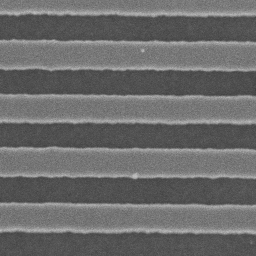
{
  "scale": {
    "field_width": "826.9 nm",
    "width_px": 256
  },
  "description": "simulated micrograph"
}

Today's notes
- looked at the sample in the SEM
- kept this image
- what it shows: lines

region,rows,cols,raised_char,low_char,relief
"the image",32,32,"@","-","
@@@@@@@@@@@@@@@@@@@@@@@@@@@@@@@@
@@@@@@@@@@@@@@@@@@@@@@@@@@@@@@@@
--------------------------------
--------------------------------
--------------------------------
@@@@@@@@@@@@@@@@@@@@@@@@@@@@@@@@
@@@@@@@@@@@@@@@@@@@@@@@@@@@@@@@@
@@@@@@@@@@@@@@@@@@@@@@@@@@@@@@@@
@@@@@@@@@@@@@@@@@@@@@@@@@@@@@@@@
--------------------------------
--------------------------------
--------------------------------
@@@@@@@@@@@@@@@@@@@@@@@@@@@@@@@@
@@@@@@@@@@@@@@@@@@@@@@@@@@@@@@@@
@@@@@@@@@@@@@@@@@@@@@@@@@@@@@@@@
---------------------@@------@@-
--------------------------------
--------------------------------
@@@@--@@------------------------
@@@@@@@@@@@@@@@@@@@@@@@@@@@@@@@@
@@@@@@@@@@@@@@@@@@@@@@@@@@@@@@@@
@@@@@@@@@@@@@@@@@@@@@@@@@@@@@@@@
--------------------------------
--------------------------------
--------------------------------
@@@@@@@@@@@@@@@@@--@-@----------
@@@@@@@@@@@@@@@@@@@@@@@@@@@@@@@@
@@@@@@@@@@@@@@@@@@@@@@@@@@@@@@@@
@@@@@@@@@@@@@@@@@@@@@@@@@@@@@@@@
--------------------------------
--------------------------------
--------------------------------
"